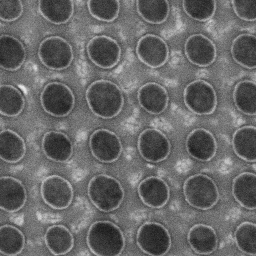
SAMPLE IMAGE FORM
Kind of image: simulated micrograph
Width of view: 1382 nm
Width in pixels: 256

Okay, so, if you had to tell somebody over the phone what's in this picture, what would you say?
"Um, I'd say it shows a regular array of raised bodies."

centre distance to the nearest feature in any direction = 253 nanometres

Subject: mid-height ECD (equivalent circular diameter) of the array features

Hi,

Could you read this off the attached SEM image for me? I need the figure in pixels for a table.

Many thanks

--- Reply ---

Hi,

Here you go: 32.1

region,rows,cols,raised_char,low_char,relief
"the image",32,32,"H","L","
HHHLLHHHHLLHHHHLLHHHHLLHHHHLLHHH
HHHLLHHHHLLHHHHLLHHHHLLHHHHLLHHH
HHLLLLHHHLLLLHLLLLHHHLLLHLLLLLLH
LLLLLLLLLLLLLLLLLLLLLLLLLLLLLLLL
HLLLLLLLLLLLLLLLLLHHLLLLHLLLLLHH
HHHLLHHHHLLHHHHLLHHHHLLHHHHLLHHH
HHHLLHHHHLLHHHHLLHHHHLLHHHHLLHHH
HHHLLHHHHLLHHHHLLLHHHLLLHHHLLHHH
HHLLLLHHLLLLLHLLLLLLLLLLLLLLLLLL
LLLLLLLLLLLLLLLLLLLLLLLLLLLLLLLL
LLLLLLHHLLLLHHLLLLHHLLLLHHLLLLHH
HHLLLHHHHLLHHHHLLHHHHLLHHHHLLHHH
HHHLLHHHHLLHHHHLLHHHHLLHHHHLLHHH
HHHLLLHHHLLHHHHLLLHHHLLLHHHLLLHH
LHLLLLLLLLLLHHLLLLLLLLLLLLLLLLLL
LLLLLLLLLLLLLLLLLLLLLLLLLLLLLLLL
HHLLLLHLLLLLHHLLLLHHLLLLHHLLLLHH
HHHLLHHHHLLHHHHLLHHHHLLHHHHLLHHH
HHHLLHHHHLLHHHHLLHHHHLLHHHHLLHHH
HHHLLLHHHLLLHHHLLLHHHLLLHHHLLLHH
LLLLLLLLLLLLLLLLLLLLLLLLLLLLLLLL
LLLLLLLLLLLLLLLLLLLLLLLLLLLLLLLL
HHLLLLHHLLLHHHHLLLHHLLLHHHHLLHHH
HHHLLHHHHLLHHHHLLHHHHLLHHHHLLHHH
HHHLLHHHHLLHHHHLLLHHHLLHHHHLLHHH
HHHLLLHHHLLLHHHLLLHHHLLLHHHLLLHH
LLLLLLLLLLLLLLLLLLLLLLLLLLLLLLLL
LLLLLLLLLLLLLLLLLLLLLLLLLLLLLLLL
HHLLLLHHLLLHHHHLLLHHLLLLHHLLLLHH
HHHLLLHHHLLHHHHLLHHHHLLLHHHLLHHH
HHHLLLHHHLLHHHHHLHHHHLLLHHHLLLHH
HHLLLLHHLLLLHHHLLLHHHLLLHHLLLLHH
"